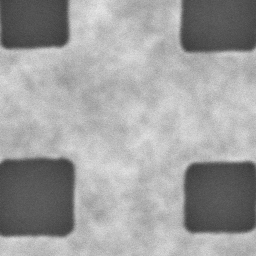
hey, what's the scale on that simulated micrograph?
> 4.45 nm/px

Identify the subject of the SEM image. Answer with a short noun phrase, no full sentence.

holes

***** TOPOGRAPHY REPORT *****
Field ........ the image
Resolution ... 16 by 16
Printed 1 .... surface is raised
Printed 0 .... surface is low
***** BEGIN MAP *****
0000111111100000
0000111111100000
0000111111100000
1111111111111111
1111111111111111
1111111111111111
1111111111111111
1111111111111111
1111111111111111
1111111111111111
0000011111110000
0000011111100000
0000011111100000
0000011111100000
0000011111110000
1111111111111111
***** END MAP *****